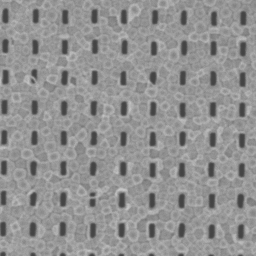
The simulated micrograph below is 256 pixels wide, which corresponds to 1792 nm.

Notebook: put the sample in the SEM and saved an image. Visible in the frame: a regular array of holes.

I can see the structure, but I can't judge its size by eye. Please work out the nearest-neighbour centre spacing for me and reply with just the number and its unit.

204 nm